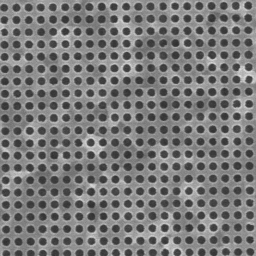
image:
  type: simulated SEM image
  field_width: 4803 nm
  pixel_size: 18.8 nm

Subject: a regular array of holes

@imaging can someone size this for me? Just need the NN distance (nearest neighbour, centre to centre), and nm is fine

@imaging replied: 223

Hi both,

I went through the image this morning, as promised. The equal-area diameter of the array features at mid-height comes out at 157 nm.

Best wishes